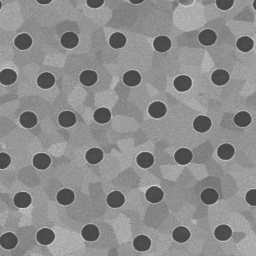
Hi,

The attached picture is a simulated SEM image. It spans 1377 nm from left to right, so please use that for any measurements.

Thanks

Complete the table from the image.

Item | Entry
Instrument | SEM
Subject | a regular array of holes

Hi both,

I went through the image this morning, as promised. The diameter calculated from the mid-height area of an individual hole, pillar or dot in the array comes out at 93.9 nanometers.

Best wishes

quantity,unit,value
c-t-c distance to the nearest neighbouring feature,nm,212